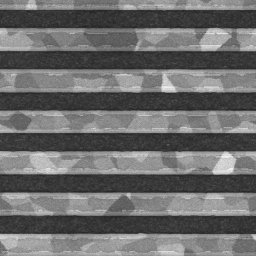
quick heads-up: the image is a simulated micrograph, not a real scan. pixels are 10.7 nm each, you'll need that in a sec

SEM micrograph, parallel lines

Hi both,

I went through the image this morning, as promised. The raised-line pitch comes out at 439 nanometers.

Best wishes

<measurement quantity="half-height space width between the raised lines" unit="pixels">21.5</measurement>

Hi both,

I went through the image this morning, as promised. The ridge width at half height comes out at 212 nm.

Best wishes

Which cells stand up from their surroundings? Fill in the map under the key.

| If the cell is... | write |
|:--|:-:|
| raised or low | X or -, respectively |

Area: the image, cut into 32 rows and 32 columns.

XXXXXXXXXXXXXXXXXXXXXXXXXXXXXXXX
--------------------------------
--------------------------------
--------------------------------
XXXXXXXXXXXXXXXXXXXXXXXXXXXXXXXX
XXXXXXXXXXXXXXXXXXXXXXXXXXXXXXXX
--------------------------------
--------------------------------
--------------------------------
XXXXXXXXXXXXXXXXXXXXXXXXXXXXXXXX
XXXXXXXXXXXXXXXXXXXXXXXXXXXXXXXX
--------------------------------
--------------------------------
--------------------------------
XXXXXXXXXXXXXXXXXXXXXXXXXXXXXXXX
XXXXXXXXXXXXXXXXXXXXXXXXXXXXXXXX
--------------------------------
--------------------------------
--------------------------------
XXXXXXXXXXXXXXXXXXXXXXXXXXXXXXXX
XXXXXXXXXXXXXXXXXXXXXXXXXXXXXXXX
XXXXXXXXXXXXXXXXXXXXXXXXXXXXXXXX
--------------------------------
--------------------------------
XXXXXXXXXXXXXXXXXXXXXXXXXXXXXXXX
XXXXXXXXXXXXXXXXXXXXXXXXXXXXXXXX
XXXXXXXXXXXXXXXXXXXXXXXXXXXXXXXX
--------------------------------
--------------------------------
-----------------X-X------------
XXXXXXXXXXXXXXXXXXXXXXXXXXXXXXXX
XXXXXXXXXXXXXXXXXXXXXXXXXXXXXXXX